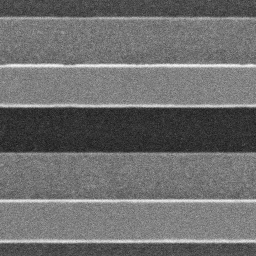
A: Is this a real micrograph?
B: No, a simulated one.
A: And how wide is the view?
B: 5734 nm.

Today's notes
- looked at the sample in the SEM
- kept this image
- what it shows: lines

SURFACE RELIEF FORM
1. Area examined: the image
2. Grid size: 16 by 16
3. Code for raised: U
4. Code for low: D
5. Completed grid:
DDDDDDDDDDDDDDDD
UUUUUUUUUUUUUUUU
UUUUUUUUUUUUUUUU
UUUUUUUUUUUUUUUU
UUUUUUUUUUUUUUUU
UUUUUUUUUUUUUUUU
UUUUUUUUUUUUUUUU
DDDDDDDDDDDDDDDD
DDDDDDDDDDDDDDDD
DDDDDDDDDDDDDDDD
UUUUUUUUUUUUUUUU
UUUUUUUUUUUUUUUU
UUUUUUUUUUUUUUUU
UUUUUUUUUUUUUUUU
UUUUUUUUUUUUUUUU
DDDDDDDDDDDDDDDD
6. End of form